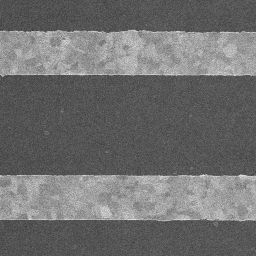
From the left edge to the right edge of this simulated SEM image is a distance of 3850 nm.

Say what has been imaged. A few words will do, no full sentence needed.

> one or a few lines or trenches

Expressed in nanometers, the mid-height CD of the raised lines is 658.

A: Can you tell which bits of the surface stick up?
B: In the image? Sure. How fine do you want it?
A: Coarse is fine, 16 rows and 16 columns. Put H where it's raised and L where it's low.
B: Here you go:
LLLLLLLLLLLLLLLL
LLLLLLLLLLLLLLLL
HHHHHHHHHHHHHHHH
HHHHHHHHHHHHHHHH
HHHHHHHHHHHHHHHH
LLLLLLLLLLLLLLLL
LLLLLLLLLLLLLLLL
LLLLLLLLLLLLLLLL
LLLLLLLLLLLLLLLL
LLLLLLLLLLLLLLLL
LLLLLLLLLLLLLLLL
HHHHHHHHHHHHHHHH
HHHHHHHHHHHHHHHH
HHHHHHHHHHHHHHHH
LLLLLLLLLLLLLLLL
LLLLLLLLLLLLLLLL